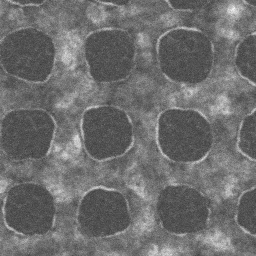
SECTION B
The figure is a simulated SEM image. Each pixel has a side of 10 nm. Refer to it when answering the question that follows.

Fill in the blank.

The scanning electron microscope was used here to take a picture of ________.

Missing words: raised bodies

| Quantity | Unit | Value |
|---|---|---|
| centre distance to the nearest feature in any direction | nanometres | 745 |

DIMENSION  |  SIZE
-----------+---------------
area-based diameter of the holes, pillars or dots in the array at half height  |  0.549 µm